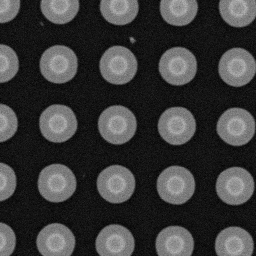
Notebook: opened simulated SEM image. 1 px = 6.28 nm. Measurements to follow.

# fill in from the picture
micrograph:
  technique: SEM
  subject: an array of small figures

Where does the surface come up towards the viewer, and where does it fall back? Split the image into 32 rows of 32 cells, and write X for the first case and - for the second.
XX---XXXXX---XXXX---XXXXX--XXXXX
XX---XXXXX---XXXX---XXXXX--XXXXX
X-----XXX----XXXX----XXX----XXXX
--------------------------------
--------------------------------
--------------------------------
XX----XXX----XXX-----XXX----XXX-
XX---XXXXX---XXXX---XXXX----XXXX
XX---XXXXX---XXXX---XXXXX--XXXXX
XX---XXXX----XXXX---XXXX----XXXX
--------------X------XX------XX-
--------------------------------
--------------------------------
X-----XXX----XXX-----XX---------
XX---XXXX----XXXX---XXXX----XXX-
XX---XXXXX--XXXXX---XXXX---XXXXX
XX---XXXX---XXXXX---XXXX---XXXXX
X-----XX-----XXX-----XXX----XXX-
--------------------------------
--------------------------------
X-------------------------------
XX---XXXX----XXX----XXXX----XXX-
XX---XXXX---XXXXX---XXXX---XXXXX
XX---XXXX---XXXXX---XXXX---XXXXX
X----XXXX----XXX----XXXX---XXXX-
-----------------------------X--
--------------------------------
--------------------------------
X----XXX-----XXX-----XX-----XX--
XX---XXXX---XXXXX---XXXX---XXXX-
XX---XXXX---XXXXX--XXXXX---XXXXX
X----XXXX---XXXXX---XXXX---XXXXX